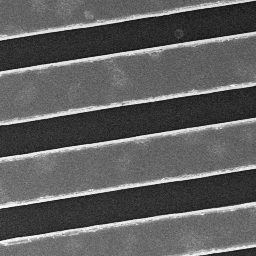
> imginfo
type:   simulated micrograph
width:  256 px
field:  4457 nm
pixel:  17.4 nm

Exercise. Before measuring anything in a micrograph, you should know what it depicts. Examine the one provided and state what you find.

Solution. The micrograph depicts one or a few lines or trenches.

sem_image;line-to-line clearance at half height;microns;0.604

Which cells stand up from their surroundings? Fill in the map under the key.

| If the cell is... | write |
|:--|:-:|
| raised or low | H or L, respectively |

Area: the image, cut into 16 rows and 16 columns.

HHHHHHHHHHHHLLLL
HHHHHHLLLLLLLLLL
LLLLLLLLLLLLLHHH
LLLLLLLHHHHHHHHH
HHHHHHHHHHHHHHHH
HHHHHHHHHHHHHHLL
HHHHHHHHLLLLLLLL
HHLLLLLLLLLLLLLL
LLLLLLLLLLHHHHHH
LLLHHHHHHHHHHHHH
HHHHHHHHHHHHHHHH
HHHHHHHHHLLLLLLL
HHHLLLLLLLLLLLLL
LLLLLLLLLLLHHHHH
LLLLHHHHHHHHHHHH
HHHHHHHHHHHHHHHL